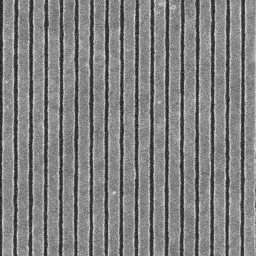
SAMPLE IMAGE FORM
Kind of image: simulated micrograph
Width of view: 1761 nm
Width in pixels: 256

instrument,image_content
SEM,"parallel lines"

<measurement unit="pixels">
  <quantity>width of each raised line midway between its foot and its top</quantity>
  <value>11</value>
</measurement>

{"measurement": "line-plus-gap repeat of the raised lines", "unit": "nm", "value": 104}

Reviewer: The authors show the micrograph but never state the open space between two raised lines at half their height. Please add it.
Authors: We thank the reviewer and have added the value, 29.2 nm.